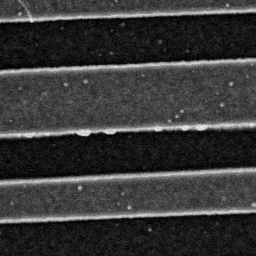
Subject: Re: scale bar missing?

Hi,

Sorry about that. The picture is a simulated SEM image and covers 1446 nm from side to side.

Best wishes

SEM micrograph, lines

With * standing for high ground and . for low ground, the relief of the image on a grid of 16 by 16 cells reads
****************
................
................
................
****************
****************
****************
****************
.*..............
................
................
****************
****************
*********.......
................
................